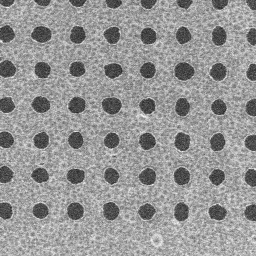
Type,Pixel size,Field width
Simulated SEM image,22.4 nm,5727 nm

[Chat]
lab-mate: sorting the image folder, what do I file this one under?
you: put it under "a regular array of holes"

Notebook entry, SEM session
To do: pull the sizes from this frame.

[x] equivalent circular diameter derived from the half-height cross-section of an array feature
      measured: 390 nanometers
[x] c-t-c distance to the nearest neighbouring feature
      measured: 777 nanometers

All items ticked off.